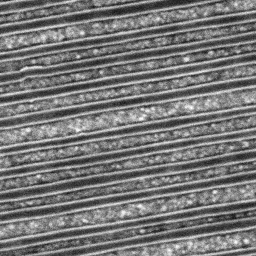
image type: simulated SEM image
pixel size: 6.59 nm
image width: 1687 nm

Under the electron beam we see parallel lines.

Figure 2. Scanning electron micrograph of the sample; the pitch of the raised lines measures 152 nanometres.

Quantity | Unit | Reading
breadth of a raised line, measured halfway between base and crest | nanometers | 67.4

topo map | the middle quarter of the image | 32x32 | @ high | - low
@@@@@@@@@@@-------------------@@
@@@@@-------------------@@@@@@@@
----------------@@@@@@@@@@@@@@@-
----------@@@@@@@@@@@@@@@-------
----@@@@@@@@@@@@@@@-------------
@@@@@@@@@@@@@-------------------
@@@@@@@---------------------@@@@
@---------------------@@@@@@@@@@
----------------@@@@@@@@@@@@@@@-
----------@@@@@@@@@@@@@@@-------
--@@@@@@@@@@@@@@@-@-------------
@@@@@@@@@@@---------------------
@@@@@---------------------------
---------------------------@@@@@
---------------------@@@@@@@@@@@
---------------@@@@@@@@@@@@@@@--
-----------@@@@@@@@@@@@@@@------
----@@@@@@@@@@@@@@--------------
@@@@@@@@@@@@--------------------
@@@@@--------------------@-@@@@@
--------------------@@@@@@@@@@@@
--------------@@@@@@@@@@@@@@----
--------@@@@@@@@@@@@@@----------
--@@@@@@@@@@@@@@----------------
@@@@@@@@@@@-------------------@@
@@@@@------------------@@@@@@@@@
-----------------@@@@@@@@@@@@@@@
----------@@@@@@@@@@@@@@@@@-----
----@@@@@@@@@@@@@@@@------------
@@@@@@@@@@@@@@------------------
@@@@@@@@------------------@@@@@@
@@@------------------@@@@@@@@@@@